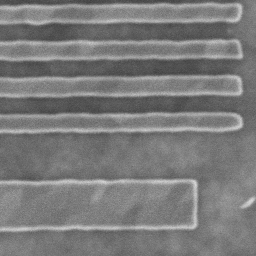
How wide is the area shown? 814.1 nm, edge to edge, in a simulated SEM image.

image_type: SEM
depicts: wiring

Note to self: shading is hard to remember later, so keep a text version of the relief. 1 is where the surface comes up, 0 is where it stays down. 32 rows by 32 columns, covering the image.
00000000000000000000000001100000
11111111111111111111111111111100
11111111111111111111111111111100
00000000000000000000000000000000
00000000000000000000000000000000
11111111111111111111111111111100
11111111111111111111111111111100
01100000000000000000000000000000
00000000000000000000000000000000
00000000000000000000000000011000
11111111111111111111111111111100
11111111111111111111111111111100
00000000000000000000000000000000
00000000000000000000000000000000
11111111111111111111111111111100
11111111111111111111111111111100
11111000000000000000000000000000
00000000000000000000000000000000
00000000000000000000000000000000
00000000000000000000000000000000
00000000000000000000000000000000
00000000000000000000000000000000
00000000000000011000001100000000
11111111111111111111111110000000
11111111111111111111111110000000
11111111111111111111111110000000
11111111111111111111111110000000
11111111111111111111111110000000
11111111101111111111110100000000
00000000000000000000000000000000
00000000000000000000000000000000
00000000000000000000000000000000